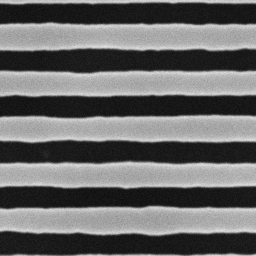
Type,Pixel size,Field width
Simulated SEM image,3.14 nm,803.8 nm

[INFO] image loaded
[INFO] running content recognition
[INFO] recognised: lines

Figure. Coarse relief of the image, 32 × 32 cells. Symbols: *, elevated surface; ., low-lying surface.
................................
................................
................................
********************************
********************************
********************************
................................
................................
................................
********************************
********************************
********************************
................................
................................
........................****....
********************************
********************************
********.*****.*****************
................................
................................
.***.*****...*******....**......
********************************
********************************
...............**...............
................................
................................
********************************
********************************
********************************
................................
................................
................................